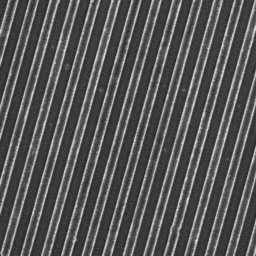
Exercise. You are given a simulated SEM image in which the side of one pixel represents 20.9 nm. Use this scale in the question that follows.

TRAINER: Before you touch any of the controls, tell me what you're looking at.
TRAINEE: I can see parallel lines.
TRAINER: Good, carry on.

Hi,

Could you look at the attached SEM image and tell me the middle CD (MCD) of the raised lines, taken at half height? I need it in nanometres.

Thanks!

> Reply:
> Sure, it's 174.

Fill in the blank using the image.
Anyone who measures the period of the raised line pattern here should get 413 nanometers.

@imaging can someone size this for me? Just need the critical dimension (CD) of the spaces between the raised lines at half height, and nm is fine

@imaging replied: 252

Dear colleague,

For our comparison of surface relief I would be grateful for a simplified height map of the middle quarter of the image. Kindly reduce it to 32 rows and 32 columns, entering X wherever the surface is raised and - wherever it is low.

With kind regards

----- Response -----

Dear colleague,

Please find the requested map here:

--XX---XX----XX---XX---XX---XX--
--XX---XX---XX---XX----X----XX--
--XX---XX---XX---XX---XX---XX---
--X----XX---XX---XX---XX---XX---
-XX---XX---XXX--XXX---XX---XX---
-XX---XX---XX---XX---XX----XX---
-XX---XX---XX---XX---XX---XX---X
XX----X----XX---XX---XX---XX---X
XX---XX---XX---XX----XX---XX---X
XX---XX---XX---XX---XX---XXX--XX
XX---XX---XX---XX---XX---XX---XX
X---XX---XXX---XX---XX---XX---XX
X---XX---XX---XX----X----XX---XX
X---XX---XX---XX---XX---XX---XX-
----X----XX---XX---XX---XX---XX-
---XX---XXX--XXX---XX---XX---XX-
---XX---XX---XX---XX---XXX---XX-
---XX---XX---XX---XX---XX---XX--
---X----XX---XX---XX---XX---XX--
--XX---XX---XX----XX---XX---XX--
--XX---XX---XX---XX---XXX--XXX--
--XX---XX---XX---XX---XX---XX---
-XX---XXX---XX---XX---XX---XX---
-XX---XX---XX----X----XX---XX---
-XX---XX---XX---XX---XX---XX----
-X----XX---XX---XX---XX---XX---X
XX---XX---XXX---XX---XX---XX---X
XX---XX---XX---XX---XXX---XX---X
XX---XX---XX---XX---XX---XX----X
X----XX---XX---XX---XX---XX---XX
X---XX---XX----X----XX---XX---XX
X---XX---XX---XX---XX---XXX---XX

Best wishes